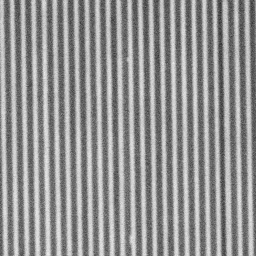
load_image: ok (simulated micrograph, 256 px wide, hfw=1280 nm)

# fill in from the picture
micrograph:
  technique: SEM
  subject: parallel lines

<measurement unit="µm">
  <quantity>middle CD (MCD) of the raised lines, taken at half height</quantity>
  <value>0.0194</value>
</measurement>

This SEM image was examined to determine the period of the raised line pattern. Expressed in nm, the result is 53.3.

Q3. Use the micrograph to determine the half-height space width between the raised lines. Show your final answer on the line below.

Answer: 33.7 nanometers